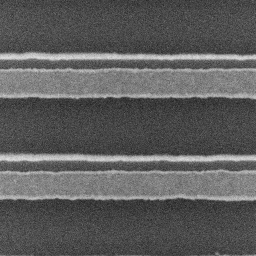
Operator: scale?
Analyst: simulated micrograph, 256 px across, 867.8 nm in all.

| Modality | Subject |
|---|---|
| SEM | lines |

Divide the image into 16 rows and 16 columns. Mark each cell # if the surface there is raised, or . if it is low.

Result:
................
................
................
................
################
################
................
................
................
................
################
################
................
................
................
................